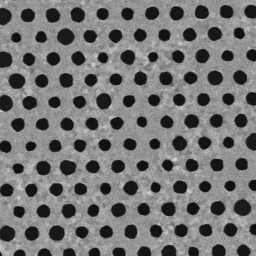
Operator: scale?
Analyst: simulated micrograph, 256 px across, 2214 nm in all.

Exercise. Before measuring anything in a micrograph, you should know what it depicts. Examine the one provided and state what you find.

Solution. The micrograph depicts a regular array of holes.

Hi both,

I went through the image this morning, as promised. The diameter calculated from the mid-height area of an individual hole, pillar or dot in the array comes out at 111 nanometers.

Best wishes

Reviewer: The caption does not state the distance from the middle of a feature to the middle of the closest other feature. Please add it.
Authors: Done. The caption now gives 212 nm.